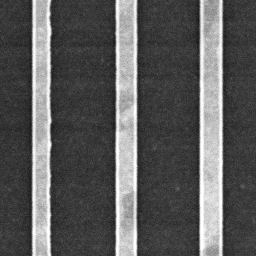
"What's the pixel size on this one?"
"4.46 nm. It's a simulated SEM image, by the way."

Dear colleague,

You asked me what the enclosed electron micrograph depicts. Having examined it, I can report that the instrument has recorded one or a few lines or trenches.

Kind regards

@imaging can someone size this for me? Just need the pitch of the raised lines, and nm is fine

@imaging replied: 380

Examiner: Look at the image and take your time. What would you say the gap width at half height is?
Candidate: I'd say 296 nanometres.